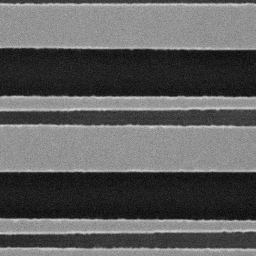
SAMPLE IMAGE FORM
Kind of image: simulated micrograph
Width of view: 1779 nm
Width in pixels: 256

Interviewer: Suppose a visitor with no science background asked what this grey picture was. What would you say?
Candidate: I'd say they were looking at lines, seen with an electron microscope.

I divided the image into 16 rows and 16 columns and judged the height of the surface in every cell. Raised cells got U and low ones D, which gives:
UUUUUUUUUUUUUUUU
UUUUUUUUUUUUUUUU
UUUUUUUUUUUUUUUU
DDDDDDDDDDDDDDDD
DDDDDDDDDDDDDDDD
DDDDDDDDDDDDDDDD
UUUUUUUUUUUUUUUU
UUUUUUUUUUUUUUUU
UUUUUUUUUUUUUUUU
UUUUUUUUUUUUUUUU
UUUUUUUUUUUUUUUU
DDDDDDDDDDDDDDDD
DDDDDDDDDDDDDDDD
DDDDDDDDDDDDDDDD
UUUUUUUUUUUUUUUU
UUUUUUUUUUUUUUUU